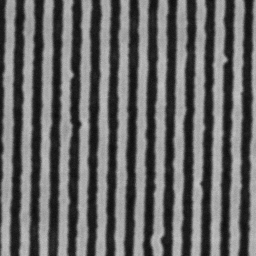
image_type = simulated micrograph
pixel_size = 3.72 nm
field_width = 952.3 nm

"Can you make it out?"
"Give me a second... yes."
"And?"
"parallel lines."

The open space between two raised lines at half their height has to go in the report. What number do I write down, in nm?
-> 37.6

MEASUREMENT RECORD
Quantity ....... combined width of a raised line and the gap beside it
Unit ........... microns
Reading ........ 0.0709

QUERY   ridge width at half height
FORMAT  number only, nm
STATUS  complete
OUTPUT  34.4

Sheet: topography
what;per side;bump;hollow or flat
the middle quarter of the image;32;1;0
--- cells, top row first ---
10001110011000110001100110001100
11001110011000110001100111001100
11001100011000110001100110001100
11001100011000110011100110001100
11001100011000110011100010001100
11001100011000110001100110001100
10001100011000110011100010001100
10001100011000110011100110001100
10001100011000110011100110001100
10001100011000110011000111001100
10001100011000110011100111001100
10001100011000110001100110001100
11001100011000110001000110001100
11001100011000110011100110001100
11001100011000110011100110001100
11001100011000110011100110001100
11001100011000110011100110001100
11001100011000110011000110001100
11001100011000110011000110011100
10001100011001110011000110011100
10001100011000110011000110001100
10001100011001110011000110001100
10001100111001100011000110001100
10001100111001100011000110001100
10001100011001110011000110011100
10001100011001100011000110001100
10001100111001110011000110001100
10001100111001110011000110001100
10001100111001110011000110011100
10001100111001110011000110011100
10001100111001110011000110011100
10001100011001100011000110011100